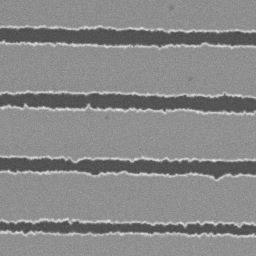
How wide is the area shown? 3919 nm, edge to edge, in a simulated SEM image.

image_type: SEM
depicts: one or a few lines or trenches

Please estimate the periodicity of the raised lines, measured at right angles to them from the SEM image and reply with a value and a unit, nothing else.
64.3 px